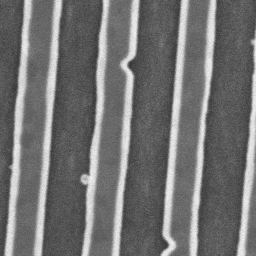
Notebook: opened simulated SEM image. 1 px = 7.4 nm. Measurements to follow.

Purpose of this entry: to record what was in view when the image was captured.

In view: one or a few lines or trenches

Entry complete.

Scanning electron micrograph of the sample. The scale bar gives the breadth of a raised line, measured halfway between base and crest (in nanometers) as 230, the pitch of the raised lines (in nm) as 574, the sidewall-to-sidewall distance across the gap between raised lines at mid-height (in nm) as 346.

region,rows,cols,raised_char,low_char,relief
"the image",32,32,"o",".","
...oooo......oooo......oooo.....
...oooo......oooo......oooo.....
...oooo......oooo......oooo.....
...oooo......oooo......oooo.....
...oooo......oooo......ooo......
...oooo......oooo......ooo......
...oooo......oooo......ooo......
...oooo.....oooo......oooo......
...oooo.....oooo......oooo......
...oooo.....oooo......oooo......
...oooo.....oooo......oooo......
...ooo......oooo......oooo......
..oooo......oooo......oooo......
..oooo......oooo......oooo......
..oooo......oooo......ooo.......
..oooo......oooo......ooo.......
..oooo......oooo......ooo......o
..oooo......oooo......ooo......o
..oooo......oooo......ooo......o
..oooo......oooo.....oooo......o
..oooo......oooo.....oooo......o
..oooo......ooo......oooo......o
..oooo.....oooo......oooo......o
..ooo......oooo......oooo......o
..ooo......oooo......oooo......o
.oooo......oooo......oooo......o
.oooo......oooo......oooo......o
.oooo......oooo......ooo......oo
.oooo......oooo......ooo......oo
.oooo......oooo......ooo......oo
.oooo......oooo......ooo......oo
.oooo......oooo......ooo......oo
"